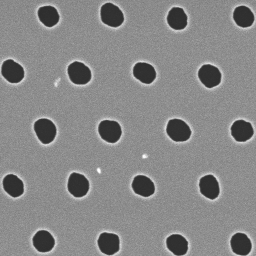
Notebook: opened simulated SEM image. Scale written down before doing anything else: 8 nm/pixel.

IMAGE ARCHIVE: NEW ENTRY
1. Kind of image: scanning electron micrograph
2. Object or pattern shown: a regular array of holes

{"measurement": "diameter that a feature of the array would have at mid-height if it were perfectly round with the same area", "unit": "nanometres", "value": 180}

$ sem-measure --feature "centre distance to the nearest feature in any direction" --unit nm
508